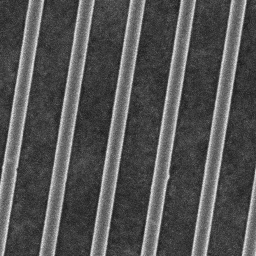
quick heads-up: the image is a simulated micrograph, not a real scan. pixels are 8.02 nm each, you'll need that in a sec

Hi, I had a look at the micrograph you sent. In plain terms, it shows parallel lines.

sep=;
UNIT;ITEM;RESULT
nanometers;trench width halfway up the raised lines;285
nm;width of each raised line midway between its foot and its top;113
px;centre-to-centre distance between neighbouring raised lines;50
